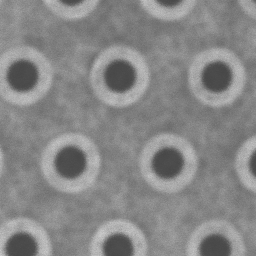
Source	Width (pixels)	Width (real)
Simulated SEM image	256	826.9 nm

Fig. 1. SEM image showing ring-shaped raised bodies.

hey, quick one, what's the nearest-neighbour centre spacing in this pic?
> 316 nm